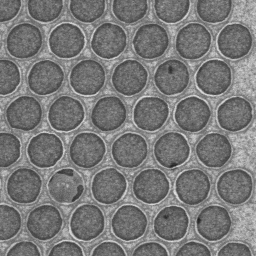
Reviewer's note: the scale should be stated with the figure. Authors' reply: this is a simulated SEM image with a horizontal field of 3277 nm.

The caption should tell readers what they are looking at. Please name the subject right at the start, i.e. a regular array of holes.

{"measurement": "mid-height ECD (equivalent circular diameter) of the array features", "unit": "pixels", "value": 35.7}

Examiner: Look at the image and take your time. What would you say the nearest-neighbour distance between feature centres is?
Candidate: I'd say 41.6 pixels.